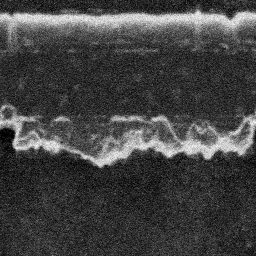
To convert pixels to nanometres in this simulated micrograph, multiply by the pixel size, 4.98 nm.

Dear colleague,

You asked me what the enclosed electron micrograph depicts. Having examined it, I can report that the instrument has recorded one or a few lines or trenches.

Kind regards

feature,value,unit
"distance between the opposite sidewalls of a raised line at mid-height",0.649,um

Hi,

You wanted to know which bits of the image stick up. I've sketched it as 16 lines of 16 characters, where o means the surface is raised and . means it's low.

................
oooooooooooooooo
oooooooooooooooo
oooooooooooooooo
oooooooooooooooo
oooooooooooooooo
oooooooooooooooo
oooooooooooooooo
.ooooooooooooooo
.....ooo........
................
................
................
................
................
................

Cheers